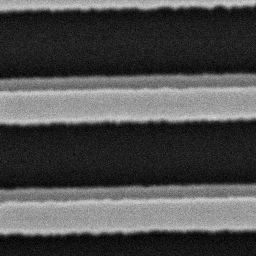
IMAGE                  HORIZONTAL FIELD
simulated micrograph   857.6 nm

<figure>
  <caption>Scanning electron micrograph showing lines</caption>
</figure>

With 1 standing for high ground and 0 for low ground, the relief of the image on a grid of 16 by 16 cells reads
1111000000000000
0000000000000000
0000000000000000
0000000000000000
0000000000000000
1111111111111111
1111111111111111
1111111110000000
0000000000000000
0000000000000000
0000000000000000
0000000000000000
1111111111111111
1111111111111111
1111100000000000
0000000000000000